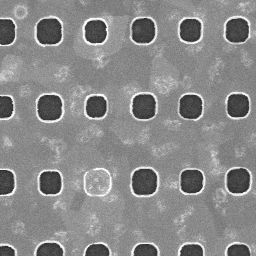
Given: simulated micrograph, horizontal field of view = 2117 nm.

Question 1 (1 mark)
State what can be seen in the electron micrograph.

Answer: a regular array of holes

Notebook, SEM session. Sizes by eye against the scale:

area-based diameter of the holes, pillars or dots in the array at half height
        214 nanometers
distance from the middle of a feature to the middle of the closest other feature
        384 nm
